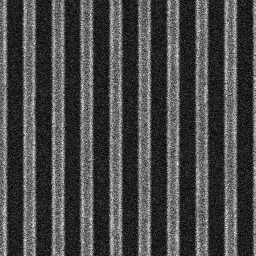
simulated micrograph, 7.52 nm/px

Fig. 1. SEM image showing parallel lines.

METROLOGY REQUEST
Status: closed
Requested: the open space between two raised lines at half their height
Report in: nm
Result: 132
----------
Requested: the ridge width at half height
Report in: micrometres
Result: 0.0799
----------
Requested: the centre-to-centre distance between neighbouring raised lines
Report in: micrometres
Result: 0.216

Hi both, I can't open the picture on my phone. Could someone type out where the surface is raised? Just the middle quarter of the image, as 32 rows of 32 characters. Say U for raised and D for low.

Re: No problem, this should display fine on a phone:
DDDDUUUDDDDDUUDDDDDUUDDDDDUUUDDD
DDDDUUUDDDDDUUDDDDDUUDDDDDUUUDDD
DDDDUUUDDDDDUUDDDDDUUDDDDDUUUDDD
DDDDUUUDDDDDUUDDDDDUUDDDDDUUUDDD
DDDDUUUDDDDDUUDDDDDUUDDDDDUUUDDD
DDDDUUUDDDDDUUDDDDDUUDDDDDUUUDDD
DDDDUUUDDDDDUUDDDDDUUDDDDDUUUDDD
DDDDUUUDDDDUUUDDDDDUUDDDDDUUUDDD
DDDDUUUDDDDDUUDDDDDUUDDDDDUUUDDD
DDDDUUUDDDDDUUDDDDDUUDDDDDUUUDDD
DDDDUUUDDDDDUUDDDDDUUDDDDDUUUDDD
DDDDUUUDDDDDUUDDDDDUUDDDDDUUUDDD
DDDDUUUDDDDDUUDDDDDUUDDDDDUUUDDD
DDDDUUUDDDDDUUDDDDDUUDDDDDUUUDDD
DDDDUUUDDDDDUUDDDDDUUDDDDDUUUDDD
DDDDUUUDDDDDUUDDDDDUUDDDDDUUUDDD
DDDDUUUDDDDDUUDDDDDUUDDDDDUUUDDD
DDDDUUUDDDDDUUDDDDDUUDDDDDUUUDDD
DDDDUUUDDDDDUUDDDDDUUDDDDDUUUDDD
DDDDUUUDDDDDUUDDDDDUUDDDDDUUUDDD
DDDDUUUDDDDDUUDDDDDUUDDDDDUUUDDD
DDDDUUUDDDDDUUDDDDDUUDDDDDUUUDDD
DDDDUUUDDDDDUUDDDDDUUDDDDDUUUDDD
DDDDUUUDDDDDUUDDDDDUUDDDDDUUUDDD
DDDDUUUDDDDDUUDDDDDUUDDDDDUUUDDD
DDDDUUUDDDDDUUDDDDDUUDDDDDUUUDDD
DDDDUUUDDDDDUUDDDDDUUDDDDDUUUDDD
DDDDUUUDDDDDUUDDDDDUUDDDDDUUUDDD
DDDDUUUDDDDDUUDDDDDUUDDDDDUUUDDD
DDDDUUUDDDDDUUDDDDDUUDDDDDUUUDDD
DDDDUUUDDDDDUUDDDDDUUDDDDDUUUDDD
DDDDUUUDDDDDUUDDDDDUUDDDDDUUUDDD